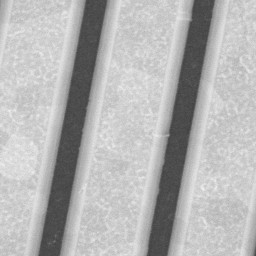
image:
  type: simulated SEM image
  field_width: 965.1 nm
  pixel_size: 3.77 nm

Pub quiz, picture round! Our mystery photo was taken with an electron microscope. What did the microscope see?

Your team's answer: one or a few lines or trenches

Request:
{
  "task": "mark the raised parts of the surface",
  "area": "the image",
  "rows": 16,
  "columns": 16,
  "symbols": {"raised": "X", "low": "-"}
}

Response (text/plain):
XXXXX--XXXXX--XX
XXXXX--XXXX---XX
XXXX---XXXX--XXX
XXXX---XXXX--XXX
XXXX--XXXXX--XXX
XXXX--XXXXX--XXX
XXXX--XXXX---XXX
XXX---XXXX---XXX
XXX---XXXX--XXXX
XXX--XXXXX--XXXX
XXX--XXXXX--XXXX
XXX--XXXX---XXXX
XXX--XXXX---XXXX
XX---XXXX--XXXXX
XX--XXXXX--XXXXX
XX--XXXXX--XXXX-